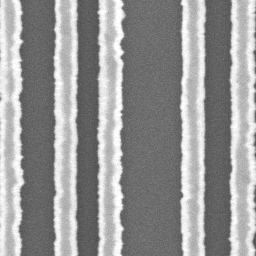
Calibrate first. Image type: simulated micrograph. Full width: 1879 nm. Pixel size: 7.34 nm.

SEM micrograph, lines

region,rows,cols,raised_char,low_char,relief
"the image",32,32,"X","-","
XX-----XXX---XX--------XX----XXX
XXX----XX---XXX--------XXX---XXX
XXX----XXX---XX--------XX----XXX
XXX----XX----XX--------XX----XXX
XX-----XXX--XXX--------XX----XXX
XXX----XXX---XX--------XX----XXX
XX-----XXX---XX--------XXX---XXX
XX-----XXX---XX--------XX----XXX
XX-----XXX---XX--------XX----XXX
XXX----XXX--XXX--------XX----XXX
XXX----XXX---XX--------XX----XXX
XX-----XX----XX--------XX----XXX
XX-----XX----XX--------XX----XXX
XX-----XXX---XX--------XX----XXX
XXX----XX---XXX--------XX----XXX
XX-----XX----XX--------XX----XXX
XX-----XXX--XXX--------XX----XXX
XX-----XXX--XXX--------XX----XXX
XXX----XX---XXX--------XX----XXX
XXX----XX---XXX--------XX----XXX
XX-----XX---XXX--------XX----XXX
XXX----XX---XXX--------XX----XXX
XXX----XX---XXX--------XX----XXX
XXX----XX---XXX--------XX----XXX
XX-----XX---XXX--------XX----XXX
XX-----XX---XXX--------XX----XXX
XXX----XX---XXX--------XX----XXX
XXX----XX---XXX--------XX----XXX
XX-----XXX--XXX--------XX----XXX
XX-----XX----XX--------XX----XXX
XXX----XX---XXX--------XX----XXX
XX-----XXX--XXX--------XX----XXX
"